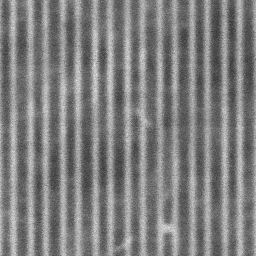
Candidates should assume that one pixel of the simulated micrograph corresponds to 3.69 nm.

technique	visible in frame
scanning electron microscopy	parallel lines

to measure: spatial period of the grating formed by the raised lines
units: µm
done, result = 0.0597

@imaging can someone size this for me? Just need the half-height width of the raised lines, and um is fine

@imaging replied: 0.0138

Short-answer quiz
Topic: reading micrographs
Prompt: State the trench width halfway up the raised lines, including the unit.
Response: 47.5 nanometres